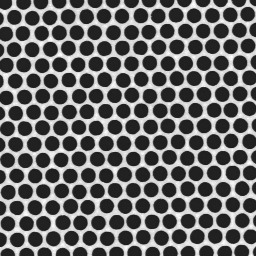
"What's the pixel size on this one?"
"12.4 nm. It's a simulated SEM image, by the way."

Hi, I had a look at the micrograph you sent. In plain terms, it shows a regular array of holes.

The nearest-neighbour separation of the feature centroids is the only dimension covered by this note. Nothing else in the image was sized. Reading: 218 nm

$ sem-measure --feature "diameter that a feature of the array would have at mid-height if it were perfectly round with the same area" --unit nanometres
184